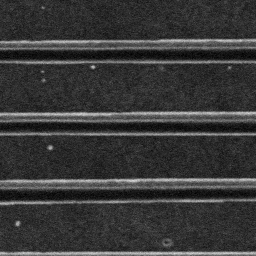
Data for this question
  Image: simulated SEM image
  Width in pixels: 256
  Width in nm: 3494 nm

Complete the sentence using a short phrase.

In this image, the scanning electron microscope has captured lines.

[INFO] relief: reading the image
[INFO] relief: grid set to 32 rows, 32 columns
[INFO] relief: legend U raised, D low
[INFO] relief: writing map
DDDDDDDDDDDDDDDDDDDDDDDDDDDDDDDD
DDDDDDDDDDDDDDDDDDDDDDDDDDDDDDDD
DDDDDDDDDDDDDDDDDDDDDDDDDDDDDDDD
DDDDDDDDDDDDDDDDDDDDDDDDDDDDDDDD
DDDDDDDDDDDDDDDDDDDDDDDDDDDDDDDD
UUUUUUUUUUUUUUUUUUUUUUUUUUUUUUUU
UUUUUUUUUUUUUUUUUUUUUUUUUUUUUUUU
UUUUUUUUUUUUUUUUUUUUUUUUUUUUUUUU
DDDDDDDDDDDDDDDDDDDDDDDDDDDDDDDD
DDDDDDDDDDDDDDDDDDDDDDDDDDDDDDDD
DDDDDDDDDDDDDDDDDDDDDDDDDDDDDDDD
DDDDDDDDDDDDDDDDDDDDDDDDDDDDDDDD
DDDDDDDDDDDDDDDDDDDDDDDDDDDDDDDD
DDDDDDDDDDDDDDDDDDDDDDDDDDDDDDDD
UUUUUUUUUUUUUUUUUUUUUUUUUUUUUUUU
UUUUUUUUUUUUUUUUUUUUUUUUUUUUUUUU
UUUUUUUUUUUUUUUUUUUUUUUUUUUUUUUU
DDDDDDDDDDDDDDDDDDDDDDDDDDDDDDDD
DDDDDDDDDDDDDDDDDDDDDDDDDDDDDDDD
DDDDDDDDDDDDDDDDDDDDDDDDDDDDDDDD
DDDDDDDDDDDDDDDDDDDDDDDDDDDDDDDD
DDDDDDDDDDDDDDDDDDDDDDDDDDDDDDDD
DDDDDDDDDDDDDDDDDDDDDDDDDDDDDDUU
UUUUUUUUUUUUUUUUUUUUUUUUUUUUUUUU
UUUUUUUUUUUUUUUUUUUUUUUUUUUUUUUU
DDDDDDDDDDDDDDDDDDDDDDDDDDDDDDDD
DDDDDDDDDDDDDDDDDDDDDDDDDDDDDDDD
DDDDDDDDDDDDDDDDDDDDDDDDDDDDDDDD
DDDDDDDDDDDDDDDDDDDDDDDDDDDDDDDD
DDDDDDDDDDDDDDDDDDDDDDDDDDDDDDDD
DDDDDDDDDDDDDDDDDDDDDDDDDDDDDDDD
DDDDDDDDDDDDDDDDDDDDDDDDDDDDDDDD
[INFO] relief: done